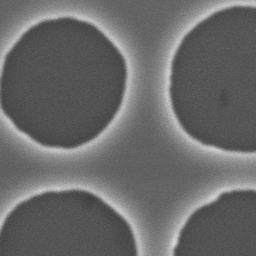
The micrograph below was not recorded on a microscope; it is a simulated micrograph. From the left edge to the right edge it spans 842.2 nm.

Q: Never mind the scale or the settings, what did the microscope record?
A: holes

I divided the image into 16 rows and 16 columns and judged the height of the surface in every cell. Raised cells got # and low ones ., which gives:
##############..
##....######....
#......####.....
........###.....
........###.....
........###.....
........###.....
#......####.....
##....######....
###############.
################
################
##....#######...
........####....
........###.....
.........##.....